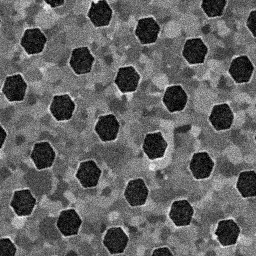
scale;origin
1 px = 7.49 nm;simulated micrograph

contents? a regular array of holes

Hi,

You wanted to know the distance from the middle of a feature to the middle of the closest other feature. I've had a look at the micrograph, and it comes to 49.9 px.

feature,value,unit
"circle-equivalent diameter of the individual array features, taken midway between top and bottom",198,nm